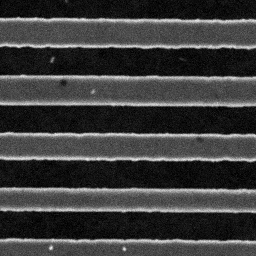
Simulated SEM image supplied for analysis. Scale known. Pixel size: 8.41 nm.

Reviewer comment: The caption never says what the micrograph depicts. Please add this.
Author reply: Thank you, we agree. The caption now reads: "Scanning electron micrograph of lines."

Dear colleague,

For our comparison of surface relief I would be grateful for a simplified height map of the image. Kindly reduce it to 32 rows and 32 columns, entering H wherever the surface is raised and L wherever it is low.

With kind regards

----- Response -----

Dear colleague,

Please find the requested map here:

LLLLLLLLLLLLLLLLLLLLLLLLLLLLLLLL
LLLLLLLLLLLLLLLLLLLLLLLLLLLLLLLL
HHHHHHHHHHHHHHHHLHHHHHHLLLLLLLLL
HHHHHHHHHHHHHHHHHHHHHHHHHHHHHHHH
HHHHHHHHHHHHHHHHHHHHHHHHHHHHHHHH
HHHHHHHHHHHHHHHHHHHHHHHHHHHHHHHH
LLLLLLLLLLLLLLLLLLLLLLLLLLLLLLLL
LLLLLLLLLLLLLLLLLLLLLLLLLLLLLLLL
LLLLLLLLLLLLLLLLLLLLLLLLLLLLLLLL
LLLLLLLLLLLLLLLLLLLLLLLLLLLLLLLL
HHHHHHHHHHHHHHHHHHHHHHHHHHHHHHHH
HHHHHHHHHHHHHHHHHHHHHHHHHHHHHHHH
HHHHHHHHHHHHHHHHHHHHHHHHHHHHHHHH
LLLLLLLLLLLLLLLLLLLLLLLLLLLLLLLL
LLLLLLLLLLLLLLLLLLLLLLLLLLLLLLLL
LLLLLLLLLLLLLLLLLLLLLLLLLLLLLLLL
LLLLLLLLLLLLLLLLLLLLLLLLLLLLLLLL
HHHHHHHHHHHHHHHHHHHHHHHHHHHHHHHH
HHHHHHHHHHHHHHHHHHHHHHHHHHHHHHHH
HHHHHHHHHHHHHHHHHHHHHHHHHHHHHHHH
LLLLLLLLLLLLLLLLLLLLLLLLLLLLLLLL
LLLLLLLLLLLLLLLLLLLLLLLLLLLLLLLL
LLLLLLLLLLLLLLLLLLLLLLLLLLLLLLLL
LLLLLLLLLLLLLLLLLLLLLLLLLLLLLLLL
HHHHHHHHHHHHHHHHHHHHHHHHHHHHHHHH
HHHHHHHHHHHHHHHHHHHHHHHHHHHHHHHH
LLLLLLLLLLLLLLLLLLLLLLLLLLLLLLLL
LLLLLLLLLLLLLLLLLLLLLLLLLLLLLLLL
LLLLLLLLLLLLLLLLLLLLLLLLLLLLLLLL
LLLLLLLLLLLLLLLLLLLLLLLLLLLLLLLL
HHHHHHHHHHHHHHHHHHHHHHHHHHHHHHHH
HHHHHHHHHHHHHHHHHHHHHHHHHHHHHHHH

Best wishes